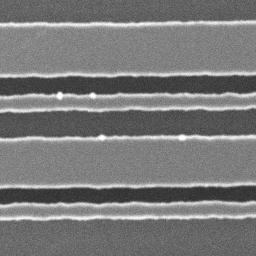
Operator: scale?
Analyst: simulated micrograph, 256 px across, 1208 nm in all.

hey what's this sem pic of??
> lines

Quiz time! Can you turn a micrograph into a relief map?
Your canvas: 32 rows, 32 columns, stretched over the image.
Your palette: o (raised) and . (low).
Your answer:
................................
................................
................................
oooooooooooooooooooooooooooooooo
oooooooooooooooooooooooooooooooo
oooooooooooooooooooooooooooooooo
oooooooooooooooooooooooooooooooo
oooooooooooooooooooooooooooooooo
oooooooooooooooooooooooooooooooo
ooooooooo.ooooo.oo.ooo..........
................................
................................
oooooooooooooooooooooooooooooooo
oooooooooooooooooooooooooooooooo
................................
................................
................................
oooooooooooooooooooooooooooooooo
oooooooooooooooooooooooooooooooo
oooooooooooooooooooooooooooooooo
oooooooooooooooooooooooooooooooo
oooooooooooooooooooooooooooooooo
oooooooooooooooooooooooooooooooo
o...........o...................
................................
..ooo..o.oo..ooooooooooooooooooo
oooooooooooooooooooooooooooooooo
................................
................................
................................
................................
................................